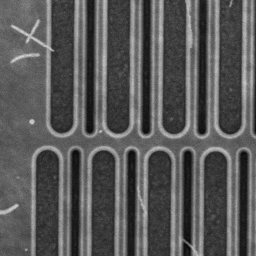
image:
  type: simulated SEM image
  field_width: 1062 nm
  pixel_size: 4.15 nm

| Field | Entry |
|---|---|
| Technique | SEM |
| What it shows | groups of lines, slits or small figures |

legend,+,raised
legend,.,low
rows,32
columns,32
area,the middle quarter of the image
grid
...++...++.......++...++.......+
...++...++.......++...++.......+
...++...++.......++...++.......+
...++...++.......++...++.......+
...++...++.......++...++.......+
...++...++.......++...++.......+
...++...++.......++...++.......+
...++...++.......++...++.......+
...++...++.......++...++.......+
...++...++.......++...++.......+
...++...++.......++...++.......+
...++...++.......++...++.......+
...++...++.......++...++.......+
...++...++.......++...++.......+
...++...++.......++...++.......+
...++...++.......++...++.......+
..+++...+++.....+++...+++.....++
.+++++.+++++...+++++.+++++...+++
++++++++++++++++++++++++++++++++
++++++++++++++++++++++++++++++++
++++++++++++++++++++++++++++++++
++..+++++..+++++..+++++..+++++++
++..+++.....++++..+++......+++..
++..+++......+++..+++......+++..
++..+++......+++..+++......+++..
++..+++......+++..+++......+++..
++..+++......+++..+++......+++..
++..+++......+++..+++......+++..
++..+++......+++..+++......+++..
++..+++......+++..+++......+++..
++..+++......+++..+++......+++..
++..+++......+++..++.......+++..